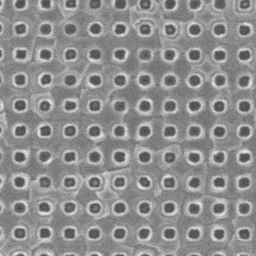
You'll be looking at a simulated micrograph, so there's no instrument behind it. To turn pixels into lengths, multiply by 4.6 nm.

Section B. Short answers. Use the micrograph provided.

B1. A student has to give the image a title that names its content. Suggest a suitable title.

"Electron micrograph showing a regular array of holes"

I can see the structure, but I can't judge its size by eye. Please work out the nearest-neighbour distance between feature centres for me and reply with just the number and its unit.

113 nanometers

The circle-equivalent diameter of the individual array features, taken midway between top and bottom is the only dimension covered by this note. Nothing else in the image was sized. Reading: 11 pixels